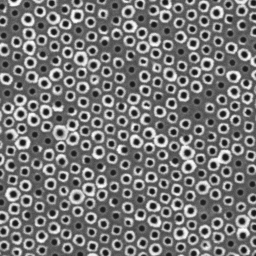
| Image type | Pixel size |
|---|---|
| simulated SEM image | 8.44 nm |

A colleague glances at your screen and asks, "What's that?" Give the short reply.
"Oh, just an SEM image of a regular array of holes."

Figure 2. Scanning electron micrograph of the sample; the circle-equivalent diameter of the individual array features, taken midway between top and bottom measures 53 nm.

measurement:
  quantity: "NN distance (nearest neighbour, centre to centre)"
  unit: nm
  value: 120